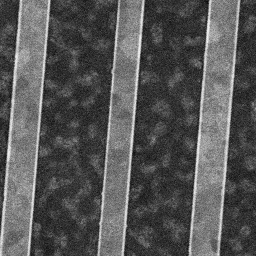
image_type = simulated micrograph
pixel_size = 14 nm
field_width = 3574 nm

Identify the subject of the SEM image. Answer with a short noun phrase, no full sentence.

one or a few lines or trenches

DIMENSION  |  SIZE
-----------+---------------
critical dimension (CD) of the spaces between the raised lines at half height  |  957 nm